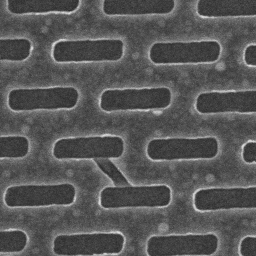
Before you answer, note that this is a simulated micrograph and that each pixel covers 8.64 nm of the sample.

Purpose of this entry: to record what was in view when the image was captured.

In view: holes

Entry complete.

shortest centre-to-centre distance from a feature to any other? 587 nm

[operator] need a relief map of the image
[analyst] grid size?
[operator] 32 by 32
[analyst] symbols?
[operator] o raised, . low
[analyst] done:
o.........ooo.........ooo.......
o.....ooooooo........oooo.......
oooooooooooooooooooooooooooooooo
oooooooooooooooooooooooooooooooo
oooooooooooooooooooooooooooooooo
....ooo........oooo........ooooo
....ooo........oooo........oooo.
...oooo.......ooooo........oooo.
oooooooooooooooooooooooooooooooo
oooooooooooooooooooooooooooooooo
oooooooooooooooooooooooooooooooo
o.........ooo........oooooooo...
o.........ooo........oooo.......
o........oooo.......ooooo.......
oooooooooooooooooooooooooooooooo
oooooooooooooooooooooooooooooooo
oooooooooooooooooooooooooooooooo
...oooo........oooo........ooooo
....ooo........ooo.........ooo..
...oooo........oooo........ooo..
oooooooooooo..oooooooooooooooooo
ooooooooooooo..ooooooooooooooooo
oooooooooooooo..oooooooooooooooo
o........oooo........oooooo.o...
o........oooo........ooo........
o........oooo........ooo........
oooooooooooooooooooooooooooooooo
oooooooooooooooooooooooooooooooo
oooooooooooooooooooooooooooooooo
...oooo........oooooo......ooooo
...oooo........ooo.........ooo..
..ooooo........ooo.........ooo..